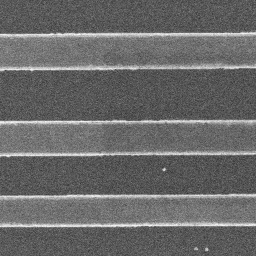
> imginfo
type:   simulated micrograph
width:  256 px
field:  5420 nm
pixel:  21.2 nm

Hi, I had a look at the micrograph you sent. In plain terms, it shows lines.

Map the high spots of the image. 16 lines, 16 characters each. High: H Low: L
LLLLLLLLLLLLLLLL
LLLLLLLLLLLLLLLL
HHHHHHHHHHHHHHHH
HHHHHHHHHHHHHHHH
LLLLLLLLLLLLLLLL
LLLLLLLLLLLLLLLL
LLLLLLLLLLLLLLLL
LLLLLLLLLLLLLLLL
HHHHHHHHHHHHHHHH
HHHHHHHHHHHHHHHH
LLLLLLLLLLLLLLLL
LLLLLLLLLLLLLLLL
HHHHHHHHHHHHHHHH
HHHHHHHHHHHHHHHH
LLLLLLLLLLLLLLLL
LLLLLLLLLLLLLLLL